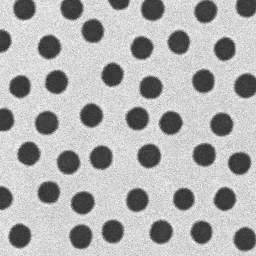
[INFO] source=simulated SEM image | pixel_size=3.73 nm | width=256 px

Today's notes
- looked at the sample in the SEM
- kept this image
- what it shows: a regular array of holes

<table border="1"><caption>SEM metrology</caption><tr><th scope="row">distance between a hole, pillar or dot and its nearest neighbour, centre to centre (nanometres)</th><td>135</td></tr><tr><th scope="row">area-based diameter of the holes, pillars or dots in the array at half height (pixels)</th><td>23.8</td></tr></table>